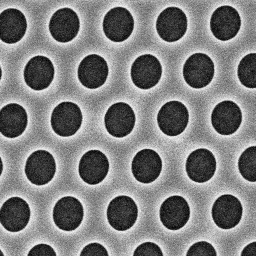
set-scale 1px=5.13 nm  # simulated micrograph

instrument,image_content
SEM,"a regular array of holes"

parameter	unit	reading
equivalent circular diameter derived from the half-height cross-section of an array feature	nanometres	170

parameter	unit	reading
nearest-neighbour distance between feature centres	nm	272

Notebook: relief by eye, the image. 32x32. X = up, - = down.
XXXXXXXXXXXXXXXXXXXXXXXXXXXXXXXX
---XXXX--XXXX---XXXX---XXXX---XX
---XXX----XXX----XXX---XXX----XX
---XXX----XXX----XXX---XXX----XX
---XXX----XXX---XXXX---XXXX--XXX
XXXXXXXXXXXXXXXXXXXXXXXXXXXXXXXX
XXXXXXXXXXXXXXXXXXXXXXXXXXXXXXXX
XXXX--XXXX---XXXX---XXX---XXXX--
XXX----XXX---XXX----XXX----XXX--
XXX----XXX---XXX----XXX----XXX--
XXX---XXXX---XXXX---XXX---XXXX--
XXXXXXXXXXXXXXXXXXXXXXXXXXXXXXXX
XXXXXXXXXXXXXXXXXXXXXXXXXXXXXXXX
---XXXX---XXXX--XXXX---XXXX---XX
---XXX----XXX----XXX----XX----XX
---XXX----XXX----XXX---XXX----XX
---XXXX---XXXX--XXXX---XXXX--XXX
XXXXXXXXXXXXXXXXXXXXXXXXXXXXXXXX
XXXXXXXXXXXXXXXXXXXXXXXXXXXXXXX-
XXXX---XXX---XXXX---XXXX---XXX--
XXX----XXX----XX----XXX----XXX--
XXX----XXX---XXX----XXX----XXX--
XXXX--XXXX---XXXX--XXXXX--XXXXX-
XXXXXXXXXXXXXXXXXXXXXXXXXXXXXXXX
XXXXXXXX-XXXXXX-XXXXX-XXXXXX-XXX
---XXXX---XXXX---XXX---XXXX---XX
----XXX---XXX----XXX----XX----XX
----XXX---XXX----XXX----XXX---XX
X--XXXX---XXXX--XXXXX--XXXXX-XXX
XXXXXXXXXXXXXXXXXXXXXXXXXXXXXXXX
XXXXX-XXXXX-XXXXXX-XXXXX--XXXXX-
XXXX---XXX---XXXX---XXX----XXX--